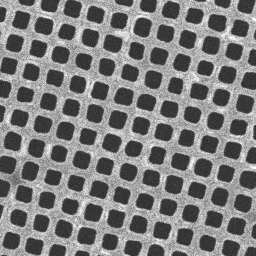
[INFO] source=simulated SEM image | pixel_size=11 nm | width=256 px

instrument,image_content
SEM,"a regular array of holes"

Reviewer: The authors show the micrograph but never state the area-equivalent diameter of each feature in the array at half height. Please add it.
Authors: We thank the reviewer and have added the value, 17.9 px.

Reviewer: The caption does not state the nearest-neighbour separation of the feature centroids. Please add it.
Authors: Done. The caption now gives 258 nm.